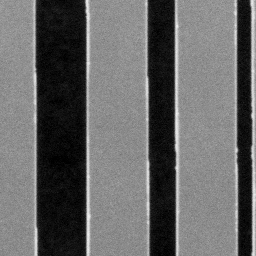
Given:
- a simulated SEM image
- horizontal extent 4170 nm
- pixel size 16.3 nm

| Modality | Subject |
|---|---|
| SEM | lines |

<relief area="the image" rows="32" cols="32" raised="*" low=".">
****.......*******....********..
****.......*******....********..
****.......*******....********..
****.......*******....********..
****.......*******....********..
****.......*******....********..
****.......*******....********..
****.......*******....********..
****.......*******....********..
****.......*******....********..
****.......*******....********..
****.......*******....********..
****.......*******....********..
****.......*******....********..
****.......*******....********..
****.......*******....********..
****.......*******....********..
****.......*******....********..
****.......*******....********..
****.......*******....********..
****.......********...********..
****.......********...********..
****.......********...********..
****.......********...********..
****.......********...********..
****.......********...********..
****.......********...********..
****.......********...********..
*****......********...********..
*****......********...********..
*****......********...********..
*****......********...********..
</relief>